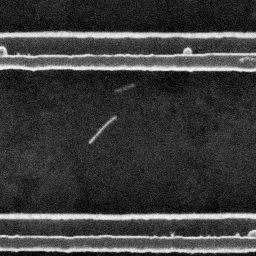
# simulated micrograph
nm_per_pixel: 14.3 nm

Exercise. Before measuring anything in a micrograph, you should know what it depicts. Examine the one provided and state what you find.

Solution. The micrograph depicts lines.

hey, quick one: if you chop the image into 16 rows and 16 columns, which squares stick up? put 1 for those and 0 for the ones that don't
0000000000000000
0000000000000000
1111111111111111
1111111111111111
0000000000000000
0000000000000000
0000000000000000
0000000000000000
0000000000000000
0000000000000000
0000000000000000
0000000000000000
0000000000000000
0000000000000000
1111111111111111
1111111111111111